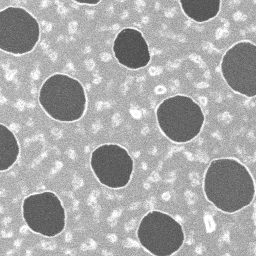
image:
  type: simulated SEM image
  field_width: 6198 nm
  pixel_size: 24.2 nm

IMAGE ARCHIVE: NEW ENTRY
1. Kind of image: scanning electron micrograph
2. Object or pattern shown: holes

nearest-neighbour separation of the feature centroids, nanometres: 2010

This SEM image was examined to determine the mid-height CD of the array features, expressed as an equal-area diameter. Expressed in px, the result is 45.1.